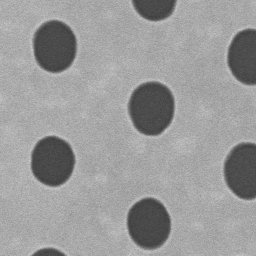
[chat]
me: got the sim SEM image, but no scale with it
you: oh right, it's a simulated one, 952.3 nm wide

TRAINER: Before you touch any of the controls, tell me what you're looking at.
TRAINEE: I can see holes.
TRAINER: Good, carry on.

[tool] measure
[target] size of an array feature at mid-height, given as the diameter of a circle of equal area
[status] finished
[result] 177 nm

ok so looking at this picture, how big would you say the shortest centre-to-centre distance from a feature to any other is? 114 pixels